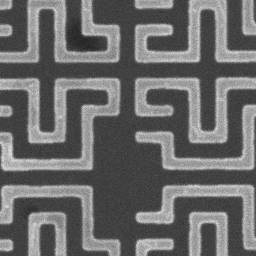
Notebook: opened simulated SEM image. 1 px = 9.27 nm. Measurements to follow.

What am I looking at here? wiring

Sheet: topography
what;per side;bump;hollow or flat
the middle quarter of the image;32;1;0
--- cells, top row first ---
00000000000000000000000000000000
00000000000000000000000000000000
00000000000000000000000000000000
00000000000000000000000000000000
11111111111110000011111111111111
11111111111111000011111111111111
00000000000111000011100000000001
00000000000111000011000000000001
00000000000111000011000000000001
00000000000110000011000000000000
00000000000110000011100000000000
00000111111110000011111111100000
00000111111110000001111111100000
00000110000000000000000000000000
00000110000000000000000000000000
00000110000000000000000000000000
00000110000000000000000000000000
00000110000000000001111111100000
00000110000000000011111111100000
00000110000000000000000011100000
00000110000000000000000001100000
00000110000000000000000001100000
00000110000000000000000001100000
00000110000000000000000001110000
11111110000000000000000001111111
11111110000000000000000001111111
00000000000000000000000000000000
00000000000000000000000000000000
00000000000000000000000000000000
00000000000000000000000000000000
00000000000000000000000000000000
11111110000000000000000001111111